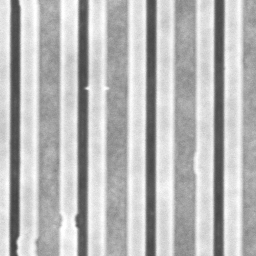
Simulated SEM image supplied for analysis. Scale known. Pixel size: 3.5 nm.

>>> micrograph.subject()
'parallel lines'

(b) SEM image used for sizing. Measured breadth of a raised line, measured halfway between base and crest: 61.2 nanometers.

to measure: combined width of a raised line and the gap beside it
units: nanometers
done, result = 119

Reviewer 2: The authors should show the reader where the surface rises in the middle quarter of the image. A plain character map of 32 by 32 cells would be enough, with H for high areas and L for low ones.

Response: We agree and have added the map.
HHHLLLHHHHLLLLLLLHHHHLLHHHHLLLLL
HHHLLLHHHHLLLLLLHHHHHLLHHHHLLLLL
HHHLLLHHHHLLLLLLHHHHHLLHHHHLLLLL
HHHHLLHHHHLLLLLLHHHHHLLHHHHLLLLL
HHHHLLHHHHLLLLLLHHHHHLLHHHHLLLLL
HHHHLLHHHHLLLLLLHHHHHLLHHHHLLLLL
HHHHLLHHHHLLLLLLHHHHHLLHHHHLLLLL
HHHHLLHHHHLLLLLLHHHHHLLHHHHLLLLL
HHHHLLHHHHLLLLLLHHHHLLLHHHHLLLLL
HHHHLLHHHHLLLLLLHHHHHLLHHHHLLLLL
HHHLLLHHHHLLLLLLHHHHHLLHHHHLLLLL
HHHLLLHHHHLLLLLLHHHHLLLHHHHLLLLL
HHHLLLHHHHLLLLLLHHHHLLLHHHHLLLLL
HHHLLLHHHHLLLLLLHHHHLLLHHHHLLLLL
HHHLLLHHHHLLLLLLHHHHLLLHHHHLLLLL
HHHLLLHHHHLLLLLLHHHHLLLHHHHLLLLL
HHHLLLHHHHLLLLLLHHHHLLLHHHHLLLLL
HHHLLLHHHHLLLLLLHHHHLLLHHHHLLLLL
HHHLLLHHHHLLLLLLHHHHLLLHHHHLLLLL
HHHLLLHHHHLLLLLLHHHHLLLHHHHLLLLL
HHHLLLHHHHLLLLLLHHHHLLLHHHHLLLLL
HHHLLLHHHHLLLLLLHHHHLLLHHHHLLLLL
HHHLLLHHHHLLLLLLHHHHLLLHHHHLLLLL
HHHLLLHHHHLLLLLLHHHHLLLHHHHLLLLL
HHHLLLHHHHLLLLLLHHHHLLLHHHHLLLLL
HHHLLLHHHHLLLLLLHHHHLLLHHHHLLLLL
HHHLLLHHHHLLLLLLHHHHLLLHHHHLLLLL
HHHLLLHHHHLLLLLLHHHHLLLHHHHLLLLL
HHHLLLHHHHLLLLLLHHHHLLLHHHHLLLLL
HHHLLLHHHHLLLLLLHHHHLLLHHHHLLLLL
HHHLLLHHHHLLLLLLHHHHHLLHHHHLLLLL
HHHLLLHHHHLLLLLLHHHHHLLHHHHLLLLL